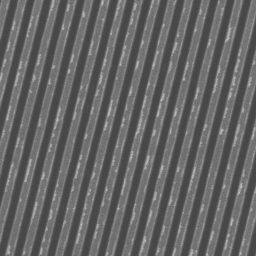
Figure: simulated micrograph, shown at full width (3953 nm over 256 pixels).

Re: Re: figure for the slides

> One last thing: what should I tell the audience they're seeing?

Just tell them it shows parallel lines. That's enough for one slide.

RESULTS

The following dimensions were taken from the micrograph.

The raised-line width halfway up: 8.49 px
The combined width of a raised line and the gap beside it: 0.25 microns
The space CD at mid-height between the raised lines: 116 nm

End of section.